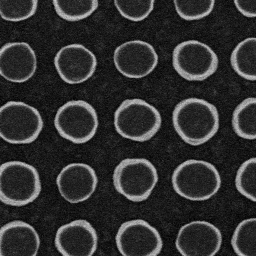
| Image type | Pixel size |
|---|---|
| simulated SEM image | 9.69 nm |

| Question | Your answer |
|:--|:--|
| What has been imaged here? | a regular array of raised bodies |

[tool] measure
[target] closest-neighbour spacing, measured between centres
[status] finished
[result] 570 nm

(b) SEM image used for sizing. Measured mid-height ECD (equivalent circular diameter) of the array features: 383 nanometers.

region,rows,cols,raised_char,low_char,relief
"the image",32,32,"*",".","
****...*****..*****...*****...**
****...****....****...****....**
.*..............................
................................
................................
..*............***.....**.....**
****...****....****...****...***
****...*****..******..*****..***
****...*****...****...*****...**
****....***.....**.....**......*
................................
................................
................................
****....***....****...****....**
*****..*****..******..*****..***
*****..*****..******..*****..***
*****...****...****....****...**
.***.....**............***......
................................
................................
.**............****....***.....*
****....****...****...*****...**
*****..*****...*****..*****...**
*****..*****...****...*****...**
****....***.....**.....***.....*
................................
................................
...............................*
.***....***....****....****...**
*****..*****...*****..*****..***
*****..*****...*****..*****..***
*****...****...*****...****...**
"